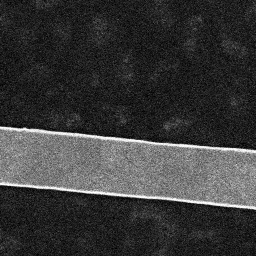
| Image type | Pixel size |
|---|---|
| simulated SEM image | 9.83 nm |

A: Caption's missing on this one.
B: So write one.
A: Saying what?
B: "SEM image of one or a few lines or trenches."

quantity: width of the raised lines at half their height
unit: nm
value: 546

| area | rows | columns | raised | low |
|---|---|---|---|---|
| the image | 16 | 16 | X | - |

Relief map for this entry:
----------------
----------------
----------------
----------------
----------------
----------------
----------------
----------------
XXXXXX----------
XXXXXXXXXXXXXXXX
XXXXXXXXXXXXXXXX
XXXXXXXXXXXXXXXX
-----------XXXXX
----------------
----------------
----------------